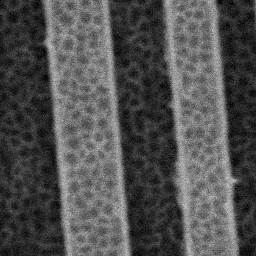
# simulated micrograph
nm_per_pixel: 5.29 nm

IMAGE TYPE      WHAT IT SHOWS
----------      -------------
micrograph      one or a few lines or trenches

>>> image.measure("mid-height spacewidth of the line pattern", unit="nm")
336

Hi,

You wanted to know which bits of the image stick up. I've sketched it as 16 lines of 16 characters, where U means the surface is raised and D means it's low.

DDDUUUUDDDDUUDDD
DDDUUUUDDDDUUDDD
DDDUUUUDDDDUUDDD
DDDUUUUDDDDUUUDD
DDDUUUUDDDDUUUDD
DDDUUUUDDDDUUUDD
DDDDUUUDDDDUUUDD
DDDDUUUDDDDUUUDD
DDDDUUUDDDDUUUDD
DDDDUUUDDDDUUUDD
DDDDUUUDDDDUUUDD
DDDDUUUUDDDUUUDD
DDDDUUUUDDDDUUDD
DDDDUUUUDDDDUUDD
DDDDUUUUDDDDUUUD
DDDDUUUUDDDDUUUD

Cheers